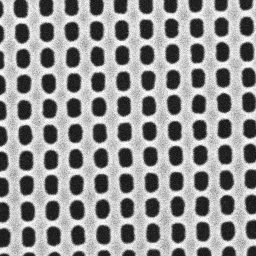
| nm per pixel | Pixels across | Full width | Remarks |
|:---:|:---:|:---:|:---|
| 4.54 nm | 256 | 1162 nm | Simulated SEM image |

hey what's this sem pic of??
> a regular array of holes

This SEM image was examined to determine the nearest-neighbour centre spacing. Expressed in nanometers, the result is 112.